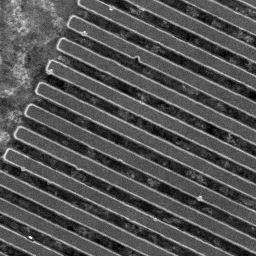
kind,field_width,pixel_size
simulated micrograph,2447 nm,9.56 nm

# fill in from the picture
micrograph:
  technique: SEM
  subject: parallel lines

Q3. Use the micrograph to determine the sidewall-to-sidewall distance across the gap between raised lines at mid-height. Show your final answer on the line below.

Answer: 110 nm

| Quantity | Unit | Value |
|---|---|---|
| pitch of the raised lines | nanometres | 234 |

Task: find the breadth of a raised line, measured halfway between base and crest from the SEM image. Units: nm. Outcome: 120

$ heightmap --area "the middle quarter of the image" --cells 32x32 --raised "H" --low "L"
LLLLLLLHHHHHHHHLLLLLLHHHHHHHHLLL
HHLLLLLLLHHHHHHHHLLLLLLHHHHHHHHL
HHHHLLLLLLLLHHHHHHHLLLLLLLHHHHHH
HHHHHHLLLLLLLHHHHHHHHLLLLLLLHHHH
LLHHHHHHHLLLLLLHHHHHHHHLLLLLLLHH
LLLLHHHHHHHLLLLLLHHHHHHHHLLLLLLL
LLLLLLHHHHHHHLLLLLLLHHHHHHHLLLLL
LLLLLLLLHHHHHHHLLLLLLLHHHHHHHLLL
HHHLLLLLLLHHHHHHHLLLLLLLHHHHHHHL
HHHHHLLLLLLLHHHHHHHLLLLLLLHHHHHH
HHHHHHHLLLLLLLHHHHHHHLLLLLLLHHHH
LLHHHHHHHLLLLLLLHHHHHHHLLLLLLLHH
LLLLHHHHHHHLLLLLLLHHHHHHHLLLLLLL
LLLLLLHHHHHHHLLLLLLLHHHHHHHLLLLL
HLLLLLLLHHHHHHHLLLLLLLHHHHHHHLLL
HHHLLLLLLLHHHHHHHLLLLLLLHHHHHHHL
HHHHHLLLLLLLHHHHHHHLLLLLLLLHHHHH
HHHHHHHLLLLLLLHHHHHHHLLLLLLLLHHH
LLHHHHHHHHLLLLLLHHHHHHHLLLLLLLHH
LLLLHHHHHHHHLLLLLLHHHHHHHHLLLLLL
LLLLLLHHHHHHHHLLLLLLLHHHHHHLLLLL
HLLLLLLLHHHHHHHHLLLLLLLHHHHHHHLL
HHHHLLLLLLHHHHHHHHLLLLLLLHHHHHHH
HHHHHHLLLLLLHHHHHHHHLLLLLLLHHHHH
LHHHHHHHLLLLLLLHHHHHHHLLLLLLLHHH
LLLHHHHHHHLLLLLLLHHHHHHHLLLLLLLH
LLLLHHHHHHHHLLLLLLLHHHHHHHLLLLLL
LLLLLLLHHHHHHHLLLLLLLHHHHHHHLLLL
HHLLLLLLLHHHHHHHLLLLLLLHHHHHHHLL
HHHHLLLLLLLHHHHHHHLLLLLLLHHHHHHH
HHHHHHLLLLLLLHHHHHHHLLLLLLLHHHHH
LHHHHHHHLLLLLLLHHHHHHHLLLLLLLHHH